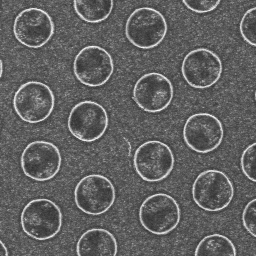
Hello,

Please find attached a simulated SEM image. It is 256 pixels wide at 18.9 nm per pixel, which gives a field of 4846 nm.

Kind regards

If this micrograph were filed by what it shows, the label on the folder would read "a regular array of raised bodies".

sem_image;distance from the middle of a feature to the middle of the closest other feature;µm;1.08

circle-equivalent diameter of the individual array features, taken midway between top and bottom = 0.727 um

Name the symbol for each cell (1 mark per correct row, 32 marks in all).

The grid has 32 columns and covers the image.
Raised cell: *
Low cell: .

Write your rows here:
.........*****.........****.....
...**.....****...***...........*
..****.....**...****..........**
..****..........*****.........**
..****..........****..........**
...**............***............
..........***...........**......
.........*****.........****.....
.........*****.........*****....
..........****....**...****.....
...**......**....****...**......
..****...........****...........
..*****..........****...........
..****...****.....**............
...***...****...........**......
.........****..........****.....
.........****..........*****....
..........**...........*****....
...****..........****...***....*
...****..........*****........**
...****..........*****........**
...****..........****.....*....*
..........***.....**.....****...
..........****..........*****...
.........*****.....**...*****...
....***...****....****...***...*
...****....**.....****.........*
...*****..........****........**
...****...........****.........*
....**....****............**....
..........****...........****...
*.........****...........****...